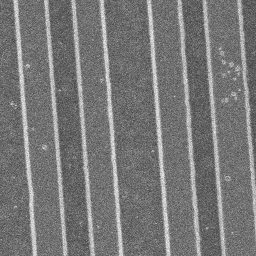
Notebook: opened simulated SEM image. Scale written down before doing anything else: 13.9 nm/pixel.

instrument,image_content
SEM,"one or a few lines or trenches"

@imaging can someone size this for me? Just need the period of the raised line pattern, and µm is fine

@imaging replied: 0.89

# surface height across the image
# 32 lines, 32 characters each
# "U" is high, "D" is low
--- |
DDUUUUDDDUUUUDDDDDDUUUUDDDUUUUDD
DDUUUUDDDUUUUDDDDDDUUUUDDDUUUUDD
DDUUUUDDDUUUUDDDDDDUUUUDDDUUUUDD
DDUUUUDDDUUUUDDDDDDUUUUDDDUUUUDD
DDUUUUDDDUUUUDDDDDDUUUUDDDUUUUDD
DDUUUUDDDUUUUDDDDDDUUUUDDDUUUUDD
DDUUUUDDDDUUUDDDDDDUUUUDDDUUUUDD
DDUUUUDDDDUUUDDDDDDUUUUDDDUUUUDD
DDDUUUDDDDUUUDDDDDDUUUUDDDUUUUUD
DDDUUUDDDDUUUDDDDDDUUUUDDDUUUUUD
DDDUUUUDDDUUUUDDDDDUUUUDDDUUUUUD
DDDUUUUDDDUUUUDDDDDUUUUDDDUUUUUD
DDDUUUUDDDUUUUDDDDDDUUUDDDUUUUUD
DDDUUUUDDDUUUUDDDDDDUUUDDDDUUUUD
DDDUUUUDDDUUUUDDDDDDUUUUDDDUUUUD
DDDUUUUDDDUUUUDDDDDDUUUUDDDUUUUD
DDDUUUUDDDUUUUDDDDDDUUUUDDDUUUUD
DDDUUUUDDDUUUUDDDDDDUUUUDDDUUUUD
DDDUUUUDDDUUUUDDDDDDUUUUDDDUUUUD
DDDUUUUDDDDUUUDDDDDDUUUUDDDUUUUD
DDDUUUUDDDDUUUDDDDDDUUUUDDDUUUUD
DDDDUUUDDDDUUUDDDDDDUUUUDDDUUUUU
DDDDUUUDDDDUUUDDDDDDUUUUDDDUUUUU
DDDDUUUUDDDUUUUDDDDDUUUUDDDUUUUU
DDDDUUUUDDDUUUUDDDDDUUUUDDDUUUUU
DDDDUUUUDDDUUUUDDDDDDUUUDDDUUUUU
DDDDUUUUDDDUUUUDDDDDDUUUDDDDUUUU
DDDDUUUUDDDUUUUDDDDDDUUUUDDDUUUU
DDDDUUUUDDDUUUUDDDDDDUUUUDDDUUUU
DDDDUUUUDDDUUUUDDDDDDUUUUDDDUUUU
DDDDUUUUDDDUUUUDDDDDDUUUUDDDUUUU
DDDDUUUUDDDUUUUDDDDDDUUUUDDDUUUU